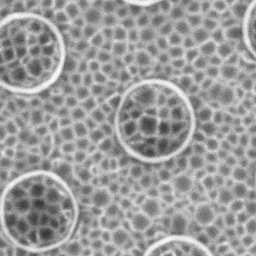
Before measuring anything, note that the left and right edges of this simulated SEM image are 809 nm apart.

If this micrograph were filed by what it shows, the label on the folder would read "raised bodies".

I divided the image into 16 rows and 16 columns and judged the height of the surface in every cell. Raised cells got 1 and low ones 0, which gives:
0000000000000000
1110000000000001
1111000000000001
1111000000000000
1111000000000000
0110000011100000
0000000011110000
0000000111110000
0000000111110000
0000000011100000
0000000000000000
0111000000000000
1111100000000000
1111100000000000
1111000000000000
0010000000111000